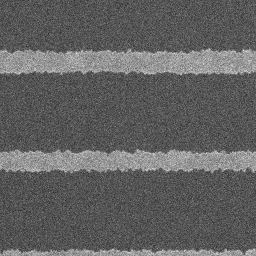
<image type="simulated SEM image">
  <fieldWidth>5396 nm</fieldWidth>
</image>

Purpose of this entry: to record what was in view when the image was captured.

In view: one or a few lines or trenches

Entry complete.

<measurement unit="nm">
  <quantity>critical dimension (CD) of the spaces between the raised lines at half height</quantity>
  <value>1700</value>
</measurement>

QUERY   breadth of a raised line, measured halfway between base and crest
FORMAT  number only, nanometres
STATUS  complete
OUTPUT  393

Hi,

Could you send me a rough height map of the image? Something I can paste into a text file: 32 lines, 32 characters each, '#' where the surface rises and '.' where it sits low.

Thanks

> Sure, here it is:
................................
................................
................................
................................
................................
................................
#.###.....#.##..#........####.##
################################
################################
................................
................................
................................
................................
................................
................................
................................
................................
................................
................................
################################
################################
................................
................................
................................
................................
................................
................................
................................
................................
................................
................................
.#....#############.#######.##.#